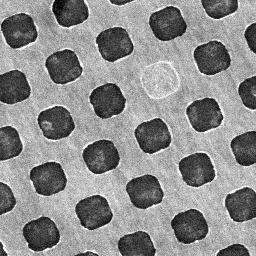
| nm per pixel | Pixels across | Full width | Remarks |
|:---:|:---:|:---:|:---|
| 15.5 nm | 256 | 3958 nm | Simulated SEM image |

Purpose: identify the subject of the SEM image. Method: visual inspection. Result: a regular array of holes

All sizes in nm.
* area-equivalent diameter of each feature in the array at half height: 557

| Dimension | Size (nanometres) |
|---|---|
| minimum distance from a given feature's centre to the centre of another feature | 858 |